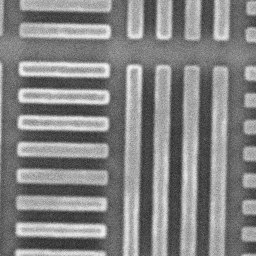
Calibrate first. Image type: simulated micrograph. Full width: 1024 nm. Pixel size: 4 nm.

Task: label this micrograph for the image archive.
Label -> groups of lines, slits or small figures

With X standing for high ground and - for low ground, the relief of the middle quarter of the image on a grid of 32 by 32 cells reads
-------XXXX-----XXX----XXX------
------XXXXX-----XXX----XXXX---XX
------XXXXX-----XXX----XXXX---XX
----------------XXX----XXXX---XX
----------------XXX----XXXX---XX
----------------XXX----XXXX---XX
----------------XXX----XXXX---XX
X---XXXXXXX-----XXX----XXX----XX
X--XXXXXXXX-----XXX----XXX----XX
XXXXXXXXXXX-----XXX----XXX----XX
----------------XXX----XXX----XX
----------------XXX----XXX----XX
----------------XXX----XXX----XX
XXXXXXXXXXX-----XXX----XXX----XX
XXXXXXXXXXX-----XXX----XXX----XX
XXXXXXXXXXX-----XXX----XXX----XX
-XXXXXXXXXX-----XXX----XXX----XX
----------------XXX----XXX----XX
----------------XXX----XXX----XX
----------------XXX----XXX----XX
XXXXXXXXXXX-----XXX----XXX----XX
XXXXXXXXXXX-----XXX----XXX----XX
XXXXXXXXXXX----XXXX----XXX----XX
---------------XXXX----XXX----XX
---------------XXXX----XXX----XX
---------------XXXX----XXX----XX
---------------XXXX---XXXX----XX
XXXXXXXXXXX----XXXX---XXXX----XX
XXXXXXXXXXX----XXXX---XXXX----XX
XXXXXXXXXXX----XXXX---XXXX----XX
---------------XXXX---XXXX----XX
---------------XXXX---XXXX----XX